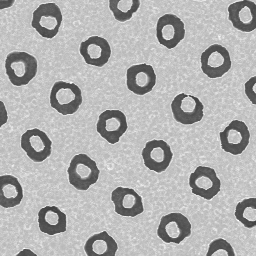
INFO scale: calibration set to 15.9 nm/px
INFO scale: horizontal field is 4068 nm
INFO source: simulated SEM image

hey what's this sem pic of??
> a regular array of ring-shaped grooves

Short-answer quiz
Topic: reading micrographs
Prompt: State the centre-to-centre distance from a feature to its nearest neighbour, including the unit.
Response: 0.859 um